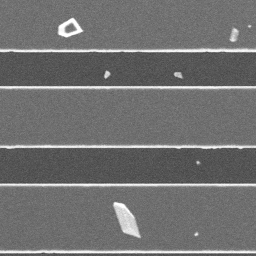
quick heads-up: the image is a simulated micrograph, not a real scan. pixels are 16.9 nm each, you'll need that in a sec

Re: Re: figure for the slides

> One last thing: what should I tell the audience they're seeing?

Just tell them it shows lines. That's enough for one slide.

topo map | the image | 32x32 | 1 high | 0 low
11111111111111111111111111111111
11111111111111111111111111111111
11111111111111111111111111111111
11111111111111111111111111111111
11111111111111111111111111111111
11111111111111111111111111111111
00000000000000000000000000000000
00000000000000000000000000000000
00000000000000000000000000000000
00000000000000000000000000000000
00000000000000000000000000000000
11111111111111111111111111111111
11111111111111111111111111111111
11111111111111111111111111111111
11111111111111111111111111111111
11111111111111111111111111111111
11111111111111111111111111111111
11111111111111111111111111111111
00000000000000000000000000000000
00000000000000000000000000000000
00000000000000000000000000000000
00000000000000000000000000000000
00000000000000000000000000000000
11111111111111111111111111111111
11111111111111111111111111111111
11111111111111111111111111111111
11111111111111111111111111111111
11111111111111111111111111111111
11111111111111111111111111111111
11111111111111111111111111111111
11111111111111111111111111111111
11111111111111111111111111111111